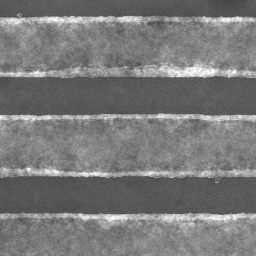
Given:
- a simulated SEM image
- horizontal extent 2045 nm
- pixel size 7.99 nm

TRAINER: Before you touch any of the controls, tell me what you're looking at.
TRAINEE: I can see lines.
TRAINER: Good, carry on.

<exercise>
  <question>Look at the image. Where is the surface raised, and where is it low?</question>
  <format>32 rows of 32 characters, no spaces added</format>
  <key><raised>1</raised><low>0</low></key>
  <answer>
00000000000000000000000000000000
00000000000000000000000000000000
11111111111111111111111111111111
11111111111111111111111111111111
11111111111111111111111111111111
11111111111111111111111111111111
11111111111111111111111111111111
11111111111111111111111111111111
11111111111111111111111111111111
00000000000000000000000000000000
00000000000000000000000000000000
00000000000000000000000000000000
00000000000000000000000000000000
00000000000000000000000000000000
11100111111111111111111111011111
11111111111111111111111111111111
11111111111111111111111111111111
11111111111111111111111111111111
11111111111111111111111111111111
11111111111111111111111111111111
11111111111111111111111111111111
11111111111111111111111111111111
00000000000000000000000000000000
00000000000000000000000000000000
00000000000000000000000000000000
00000000000000000000000000000000
00000000000000000000000000000000
11111111111111111111111111111111
11111111111111111111111111111111
11111111111111111111111111111111
11111111111111111111111111111111
11111111111111111111111111111111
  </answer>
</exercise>